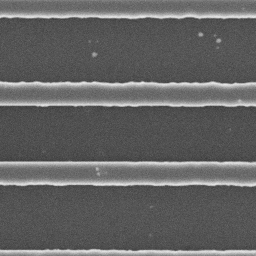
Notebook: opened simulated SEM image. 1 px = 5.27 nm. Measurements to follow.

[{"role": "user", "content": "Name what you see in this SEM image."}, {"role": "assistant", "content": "lines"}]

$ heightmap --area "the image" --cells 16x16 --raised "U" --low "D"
UUUUUUUUUUUUUUUU
DDDDDDDDDDDDDDDD
DDDDDDDDDDDDDDDD
DDDDDDDDDDDDDDDD
DDDDDDDDDDDDDDDD
UUUUUUUUUUUUUUUU
UUUUUUUUUUUUUUUU
DDDDDDDDDDDDDDDD
DDDDDDDDDDDDDDDD
DDDDDDDDDDDDDDDD
UUUUUUUUUUUUUUUU
UUUUUUUUUUUUUUUU
DDDDDDDDDDDDDDDD
DDDDDDDDDDDDDDDD
DDDDDDDDDDDDDDDD
DDDDDDDDDDDDDDDD